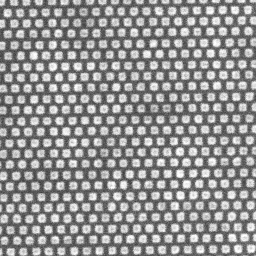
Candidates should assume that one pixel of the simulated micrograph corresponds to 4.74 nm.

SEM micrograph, a regular array of raised bodies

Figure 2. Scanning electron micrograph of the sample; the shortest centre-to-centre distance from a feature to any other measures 0.0576 micrometres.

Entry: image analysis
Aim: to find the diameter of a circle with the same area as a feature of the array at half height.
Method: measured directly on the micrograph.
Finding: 34.2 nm